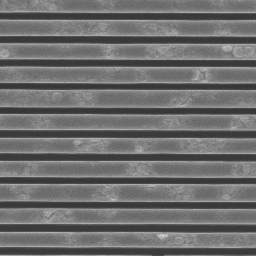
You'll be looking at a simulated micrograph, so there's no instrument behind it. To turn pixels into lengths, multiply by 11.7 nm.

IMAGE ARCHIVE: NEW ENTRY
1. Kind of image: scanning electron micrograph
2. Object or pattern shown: parallel lines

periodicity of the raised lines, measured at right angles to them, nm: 276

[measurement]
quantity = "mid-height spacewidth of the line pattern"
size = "79 nm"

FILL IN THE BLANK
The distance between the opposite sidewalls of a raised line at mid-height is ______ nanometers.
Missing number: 193